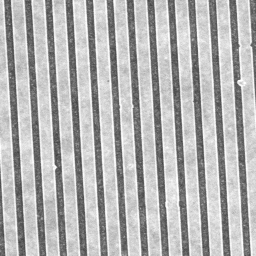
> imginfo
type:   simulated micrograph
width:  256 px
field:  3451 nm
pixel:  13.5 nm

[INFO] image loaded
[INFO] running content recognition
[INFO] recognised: parallel lines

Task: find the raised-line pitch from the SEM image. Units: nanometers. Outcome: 275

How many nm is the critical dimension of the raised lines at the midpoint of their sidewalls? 165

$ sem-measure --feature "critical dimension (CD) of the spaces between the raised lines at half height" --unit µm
0.114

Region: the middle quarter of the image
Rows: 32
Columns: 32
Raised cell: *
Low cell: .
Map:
*..***..***..***...***..***..***
*..***..***..***...***..***..***
*..***...**...**...***..***..***
*..***...**...**...***..***..***
*..****..***..***..***..***..***
*...***..***..***..***..***..***
*...***..***..***..***..***..***
**..***..***..***..***..***..***
**..***..***..***..***..***..***
**..***..***..***..***..***..***
**..***..***..***..***..***..***
**..***..***..***..***..***..***
**..***..***..***..***..***...**
**..***..***..***..***..***...**
**..***..***..***..***..****..**
**..***..***..***...**...***..**
**..***..***..***...**...***..**
**..***..***..***...**...***..**
**..***..***..***...***..***..**
**..***...**...**...***..***..**
**..***...**...**...***..***..**
**..****..***..***..***..***..**
**...***..***..***..***..***..**
**...***..***..***..***..***..**
**...***..***..***..***..***..**
***..***..***..***..***..***..**
***..***..***..***..***..***..**
***..***..***..***..***..***..**
***..***..***..***..***..***..**
***..***..***..***..***..***...*
***..***..***..***..***..***...*
***..***..***..***..***..****..*